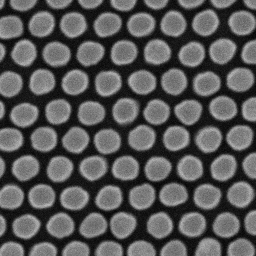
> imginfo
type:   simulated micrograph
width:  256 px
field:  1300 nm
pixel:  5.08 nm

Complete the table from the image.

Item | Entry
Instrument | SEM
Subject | a regular array of raised bodies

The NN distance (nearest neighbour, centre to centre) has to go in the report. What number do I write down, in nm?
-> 159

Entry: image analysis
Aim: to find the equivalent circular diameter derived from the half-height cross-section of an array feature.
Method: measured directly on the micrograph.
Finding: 126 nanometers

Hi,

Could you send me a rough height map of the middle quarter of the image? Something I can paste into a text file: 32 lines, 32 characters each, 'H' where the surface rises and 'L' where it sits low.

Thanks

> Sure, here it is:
LLLLLHLLLLLLLLLLLLLLLLLLLLLLLLLL
LLLLLLLLLLLLLLLLLLLLLLLLLLHHHLLL
LHHHHLLLLHHHHLLLLHHHHHLLLHHHHHLL
HHHHHHLLHHHHHHLLLHHHHHHLLHHHHHLL
HHHHHHLLHHHHHHLLHHHHHHHLLHHHHHHL
HHHHHHLLHHHHHHLLLHHHHHHLLHHHHHHL
HHHHHLLLLHHHHLLLLHHHHHLLLHHHHHLL
LLHLLLLLLHHHLLLLLLLHHLLLLLLHHLLL
LLLLLLLLLLLLLLLLLLLLLLLLLLLLLLLL
HLLLLLLLLLLLLHHHHLLLLLHHHLLLLLHH
HLLLHHHHHLLLLHHHHHLLLHHHHHLLLHHH
HHLLHHHHHHLLHHHHHHLLHHHHHHLLHHHH
HLLLHHHHHHLLHHHHHHLLHHHHHHLLHHHH
HLLLHHHHHHLLLHHHHHLLHHHHHHLLLHHH
LLLLLHHHHLLLLLHLLLLLLHHHHLLLLLHH
LLLLLLLLLLLLLLLLLLLLLLLLLLLLLLLL
LHHHHLLLLLLHLLLLLHHHHHLLLLHHHHLL
LHHHHHLLHHHHHLLLHHHHHHLLLHHHHHHL
HHHHHHLLHHHHHHLLHHHHHHHLLHHHHHHL
HHHHHHLLHHHHHHLLHHHHHHLLLHHHHHHL
HHHHHHLLHHHHHHLLLHHHHHLLLLHHHHLL
LHHHHLLLHHHHHLLLLLHHLLLLLLHHLLLL
LLLLLLLLLLLLLLLLLLLLLLLLLLLLLLLL
LLLLLLHHHLLLLLHHHLLLLLLLHLLLLLHH
HHLLLHHHHHLLLHHHHHLLLHHHHHLLLHHH
HHLLHHHHHHLLHHHHHHHLHHHHHHHLLHHH
HHLLHHHHHHLLHHHHHHLLHHHHHHLLLHHH
HLLLLHHHHHLLHHHHHHLLLHHHHHLLLHHH
LLLLLLHHHLLLLLHHHHLLLHHHHLLLLLHH
LLLLLLLLLLLLLLLLLLLLLLLLLLLLLLLL
LLLLLLLLLLLLLLLLLLLHHHLLLHHHHHLL
HHHHHLLLLHHHHHLLLHHHHHHLLHHHHHLL